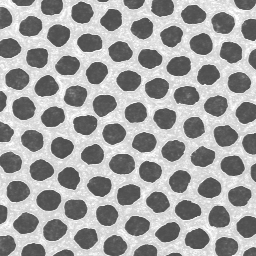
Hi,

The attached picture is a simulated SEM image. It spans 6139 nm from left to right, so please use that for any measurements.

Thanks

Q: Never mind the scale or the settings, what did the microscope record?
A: a regular array of holes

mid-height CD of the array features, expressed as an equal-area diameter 532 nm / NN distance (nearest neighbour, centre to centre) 29.9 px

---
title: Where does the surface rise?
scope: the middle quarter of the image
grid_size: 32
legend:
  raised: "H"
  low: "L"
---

LLLLHHLLLLLHHHHHHHHHLLLHHHLLLLLL
LLLLHHLLLLLHHHHHHHHHHHHHHHLLLLLL
LLLHHLLLLLLHHHLLLLLHHHHHHHLLLLLH
HHHHHHLLLLHHHLLLLLLHHHHLHHHHHHHH
HHHHHHLLLHHHHLLLLLLHHLLLLLHHHHHH
HHLLHHHHHHHHHHLLLLLHLLLLLLHHHHHH
HLLLLLHHHHHHHHHLLLHHLLLLLLHHLLLL
LLLLLLHHHHHHHHHHHHHHHLLLLLHLLLLL
LLLLLHHHLLLLLHHHHHHHHHLLLHHHLLLL
LLLLLHHLLLLLLHHHHHHHHHHHHHHHLLLL
HHLLHHHLLLLLLHHHLLLLHHHHHHHHHHHH
HHHHHHHLLLLLLHHLLLLLLHHLLLLHHHHH
HHHHHHHHLLLHHHHLLLLLLHHLLLLLHHHH
HHHLLLLLHHHHHHHLLLLLLHLLLLLLHHHH
HHLLLLLLHHHHHHHHLLLHHHHLLLLLHHLL
HHLLLLLLHHLLLLLHHHHHHHHLLLLHHHLL
HHHLLLLLHHLLLLLHHHHHHHHHHHHHHHLL
HHHHLLLHHHLLLLLLHHHLLLHHHHHHHHLL
HHHHHHHHHHLLLLLHHLLLLLLHHHHHHHHL
LLHHHHHHHHHLLLHHHLLLLLLHHHLLLLHH
LLHHHHLLLHHHHHHHHLLLLLLHHLLLLLHH
LLHHHLLLLLHHHHHHHHLLLLHHLLLLLLHH
LLHHLLLLLLHHHLLLHHHHHHHHLLLLLLHH
HHHHLLLLLLHHLLLLLHHHHHHHHLLLLHHH
HHHHHLLLLHHLLLLLLLHHLLHHHHHHHHHH
HHHHHHHHHHHLLLLLLLHLLLLLHHHHHHHH
LLLHHHHHHHHHLLLLLHHLLLLLLHHHHHHH
LLLLHHHHHHHHHLLLHHHLLLLLHHHLLLLH
LLLLHHHLLLLHHHHHHHHLLLLLHHLLLLLL
LLLLHHLLLLLLHHHHHHHHHLLHHHLLLLLH
LLLHHHLLLLLLHHHLLLHHHHHHHHLLLLLH
HHHHHHLLLLLLHHLLLLLHHHHHHHHLLLHH